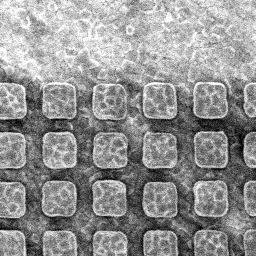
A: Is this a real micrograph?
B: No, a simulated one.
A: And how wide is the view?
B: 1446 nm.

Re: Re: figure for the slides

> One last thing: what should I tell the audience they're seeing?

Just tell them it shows a regular array of raised bodies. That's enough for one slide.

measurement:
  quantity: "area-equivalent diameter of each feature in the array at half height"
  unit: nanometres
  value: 212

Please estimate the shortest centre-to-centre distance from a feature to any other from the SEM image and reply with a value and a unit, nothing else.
274 nm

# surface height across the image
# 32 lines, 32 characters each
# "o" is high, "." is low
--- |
................................
................................
................................
................................
................................
................................
................................
................................
................................
................................
oo....oo...........oo....oo....o
ooo..oooo...oooo..oooo..oooo...o
ooo..oooo...oooo..oooo..oooo...o
ooo..oooo...oooo..oooo..oooo...o
ooo...ooo...oooo..oooo...ooo...o
................................
.........................ooo....
ooo...ooo...oooo..oooo..oooo...o
ooo..ooooo..oooo..oooo..oooo..oo
ooo..ooooo..oooo..oooo..oooo..oo
ooo...ooo...oooo..oooo...ooo...o
................................
................................
ooo..oooo...oooo..oooo..oooo...o
ooo..oooo...oooo..oooo..oooo...o
ooo..oooo...oooo..oooo..oooo...o
ooo...ooo...oooo..oooo...ooo...o
................................
................................
ooo..oooo...oooo..oooo..oooo...o
ooo..ooooo..oooo..oooo..oooo...o
ooo..ooooo..oooo..oooo..ooooo..o